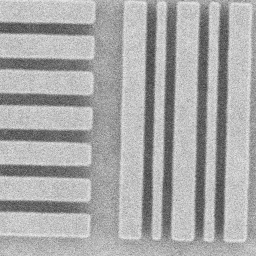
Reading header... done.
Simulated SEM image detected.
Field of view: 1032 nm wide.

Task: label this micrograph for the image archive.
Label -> groups of lines, slits or small figures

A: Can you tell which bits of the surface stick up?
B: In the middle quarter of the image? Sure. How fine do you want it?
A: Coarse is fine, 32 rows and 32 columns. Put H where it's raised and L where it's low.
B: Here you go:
LLLLLLLLLLLLLLLHHHHHLLLHHLLLHHHH
LLLLLLLLLLLLLLLHHHHHLLLHHLLLHHHH
HHHHHHHLLLLLLLLHHHHHLLLHHLLLHHHH
HHHHHHHLLLLLLLLHHHHHLLLHHLLLHHHH
HHHHHHHLLLLLLLLHHHHHLLLHHLLLHHHH
HHHHHHHLLLLLLLLHHHHHLLLHHLLLHHHH
HHHHHHHLLLLLLLLHHHHHLLLHHLLLHHHH
LLLLLHHLLLLLLLLHHHHHLLLHHLLLHHHH
LLLLLLLLLLLLLLLHHHHHLLLHHLLLHHHH
LLLLLLLLLLLLLLLHHHHHLLLHHLLLHHHH
LLLLLLLLLLLLLLLHHHHHLLLHHLLLHHHH
HHHHHHHLLLLLLLLHHHHHLLLHHLLLHHHH
HHHHHHHLLLLLLLLHHHHHLLLHHLLLHHHH
HHHHHHHLLLLLLLLHHHHHLLLHHLLLHHHH
HHHHHHHLLLLLLLLHHHHHLLLHHLLLHHHH
HHHHHHHLLLLLLLLHHHHHLLLHHLLLHHHH
LLLLLLLLLLLLLLLHHHHHLLLHHLLLHHHH
LLLLLLLLLLLLLLLHHHHHLLLHHLLLHHHH
LLLLLLLLLLLLLLLHHHHHLLLHHLLLHHHH
LLLLLLLLLLLLLLHHHHHHLLLHHLLLHHHH
HHHHHHLLLLLLLLHHHHHHLLLHHLLLHHHH
HHHHHHLLLLLLLLHHHHHHLLLHHLLLHHHH
HHHHHHLLLLLLLLHHHHHHLLLHHLLLHHHH
HHHHHHLLLLLLLLHHHHHHLLLHHLLHHHHH
HHHHHHLLLLLLLLHHHHHHLLLHHLLHHHHH
LLLLLLLLLLLLLLHHHHHHLLHHHLLHHHHH
LLLLLLLLLLLLLLHHHHHHLLHHHLLHHHHH
LLLLLLLLLLLLLLHHHHHHLLHHHLLHHHHH
LLLLLLLLLLLLLLHHHHHHLLHHHLLHHHHH
HHHHHHLLLLLLLLHHHHHHLLHHLLLHHHHH
HHHHHHLLLLLLLLHHHHHLLLHHLLLHHHHH
HHHHHHLLLLLLLLHHHHHLLLHHLLLHHHHH